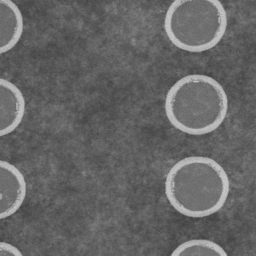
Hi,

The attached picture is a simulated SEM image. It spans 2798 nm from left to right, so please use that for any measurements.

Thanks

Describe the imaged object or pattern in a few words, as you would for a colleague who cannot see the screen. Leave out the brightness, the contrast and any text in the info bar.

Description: raised bodies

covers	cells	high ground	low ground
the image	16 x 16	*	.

*..........***..
*.........****..
*..........**...
................
................
*..........***..
*..........***..
*..........***..
................
................
*..........***..
*..........***..
*..........***..
................
................
*..........***..